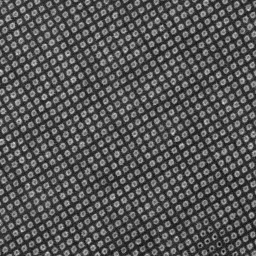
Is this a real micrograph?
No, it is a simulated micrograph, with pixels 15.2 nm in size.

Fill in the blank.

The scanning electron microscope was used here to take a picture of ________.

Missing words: a regular array of raised bodies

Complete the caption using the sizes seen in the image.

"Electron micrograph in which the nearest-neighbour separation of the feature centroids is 0.128 µm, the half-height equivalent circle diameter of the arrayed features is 80.7 nanometres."